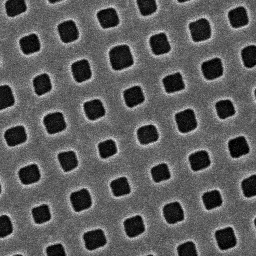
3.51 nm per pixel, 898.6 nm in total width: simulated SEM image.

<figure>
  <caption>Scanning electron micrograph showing a regular array of holes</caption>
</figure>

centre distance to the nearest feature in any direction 142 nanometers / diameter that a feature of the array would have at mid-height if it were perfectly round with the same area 0.0785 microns